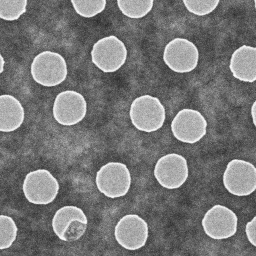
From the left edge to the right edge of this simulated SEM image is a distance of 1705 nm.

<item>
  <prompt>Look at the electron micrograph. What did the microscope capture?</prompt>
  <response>a regular array of raised bodies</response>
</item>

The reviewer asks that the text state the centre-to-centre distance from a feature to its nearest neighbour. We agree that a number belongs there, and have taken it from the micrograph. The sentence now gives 0.308 um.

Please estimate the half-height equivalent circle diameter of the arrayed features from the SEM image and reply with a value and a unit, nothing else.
223 nanometres